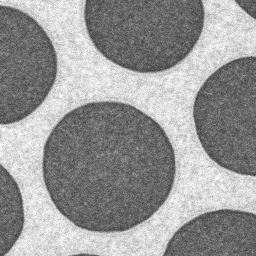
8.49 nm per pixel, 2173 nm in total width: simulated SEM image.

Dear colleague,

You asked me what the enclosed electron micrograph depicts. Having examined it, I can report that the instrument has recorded holes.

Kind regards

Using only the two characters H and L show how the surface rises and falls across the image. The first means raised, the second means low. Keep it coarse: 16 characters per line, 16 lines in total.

LHHHHLLLLLLLLHHL
LLHHHLLLLLLLLHHH
LLLHHHLLLLLLHHHH
LLLLHHLLLLLLHHHH
LLLLHHHHLLHHHLLL
LLLHHHHHHHHHHLLL
LLLHHLLLHHHHLLLL
LHHHLLLLLLHHLLLL
HHHLLLLLLLHHLLLL
HHHLLLLLLLLHHLLL
HHHLLLLLLLLHHHLL
LHHLLLLLLLLHHHHH
LHHLLLLLLLHHHHHH
LLHHLLLLLHHHLLLL
LHHHHHLHHHHLLLLL
LHHHHHHHHHLLLLLL